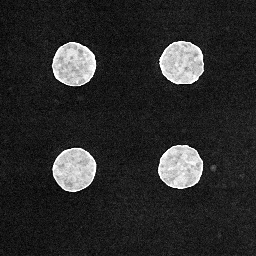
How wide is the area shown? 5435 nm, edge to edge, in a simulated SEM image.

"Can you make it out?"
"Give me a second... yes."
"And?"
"raised bodies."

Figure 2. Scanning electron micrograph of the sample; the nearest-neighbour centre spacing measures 2.22 um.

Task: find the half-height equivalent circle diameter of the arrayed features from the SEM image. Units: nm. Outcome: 919